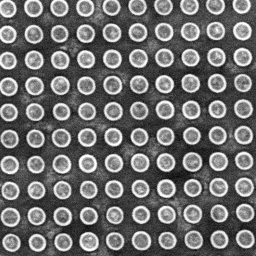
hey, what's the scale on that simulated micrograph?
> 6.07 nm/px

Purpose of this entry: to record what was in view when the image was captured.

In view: a regular array of raised bodies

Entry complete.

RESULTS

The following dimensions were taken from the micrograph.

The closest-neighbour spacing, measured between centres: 157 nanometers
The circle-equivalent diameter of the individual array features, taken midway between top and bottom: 0.103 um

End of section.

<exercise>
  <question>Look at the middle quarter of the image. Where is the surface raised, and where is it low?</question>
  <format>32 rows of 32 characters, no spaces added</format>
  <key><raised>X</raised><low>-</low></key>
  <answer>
X---XXX----XX-----XX------------
--------------------------------
--------------------------------
-----X-----XX----XXX----XX----XX
X---XXX---XXXX---XXXX--XXXX---XX
X--XXXXX--XXXX---XXXX--XXXX---XX
X---XXX---XXXX---XXX----XXX---XX
--------------------------------
--------------------------------
-------------------------X-----X
X---XXX----XXX---XXX---XXXX---XX
X---XXXX--XXXX---XXXX--XXXX---XX
X---XXXX--XXXX---XXXX---XXX---XX
X----XX----XXX----XX-----X------
--------------------------------
--------------------------------
-----XX----XX-----XX----XX-----X
X---XXXX--XXXX---XXXX--XXXX---XX
X---XXXX--XXXX---XXXX--XXXX---XX
X---XXXX---XXX---XXX----XXX----X
--------------------------------
--------------------------------
-------------------------------X
X---XXX----XXX---XXXX---XXX---XX
X---XXXX---XXXX--XXXX--XXXX---XX
XX--XXXX---XXXX--XXXX---XXX---XX
X----XX----XXX----XX-----X-----X
--------------------------------
--------------------------------
------------X-----XX----XXX----X
X---XXXX---XXX---XXXX---XXX---XX
XX--XXXX---XXX---XXXX---XXXX--XX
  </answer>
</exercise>